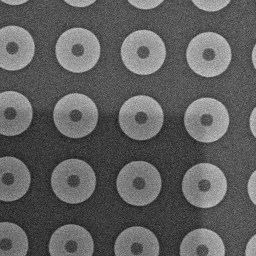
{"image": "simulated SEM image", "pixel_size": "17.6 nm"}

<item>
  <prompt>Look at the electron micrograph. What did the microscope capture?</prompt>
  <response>an array of small figures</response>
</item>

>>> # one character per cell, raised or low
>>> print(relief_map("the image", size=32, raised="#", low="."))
.##......##.....####....####....
................................
................................
###.............................
####....####....####.....###....
####...#####...#####....#####...
####...#####...######..######...
####...#####...######..######...
###.....###.....####....####....
.........................##.....
................................
.#..............................
###.....###.....###......##.....
####...#####...#####...#####....
####...#####...#####...######..#
####...#####...#####...######..#
###.....###.....####...#####....
.........................##.....
................................
................................
###....####.....###......#......
####...#####...#####...#####....
####..######...#####...#####...#
####...#####...#####...#####...#
###....####....#####...#####...#
................##......###.....
................................
................................
###....###......##..............
###...#####....####....####.....
###...######..######...#####...#
###...######..######...#####...#